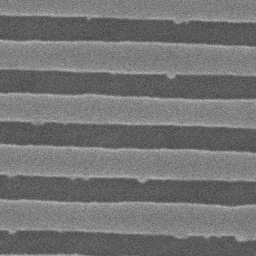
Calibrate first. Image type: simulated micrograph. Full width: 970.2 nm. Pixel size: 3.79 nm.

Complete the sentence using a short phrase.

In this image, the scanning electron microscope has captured lines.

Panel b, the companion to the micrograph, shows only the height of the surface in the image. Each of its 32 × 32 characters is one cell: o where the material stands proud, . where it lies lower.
oooooooooooooooooooooooooooooooo
oooooooooooooooooooooooooooooooo
......................o..ooooooo
................................
................................
oooooooooooooooooooooo..........
oooooooooooooooooooooooooooooooo
oooooooooooooooooooooooooooooooo
oooooooooooooooooooooooooooooooo
.....................o..........
................................
................................
ooooooooooooooooooooooo.........
oooooooooooooooooooooooooooooooo
oooooooooooooooooooooooooooooooo
...............ooooooooooooooooo
................................
................................
oooooooooo......................
oooooooooooooooooooooooooooooooo
oooooooooooooooooooooooooooooooo
oooooooooooooooooooooooooooooooo
.................o..........oooo
................................
................................
oooooooooooooooooooooooo........
oooooooooooooooooooooooooooooooo
oooooooooooooooooooooooooooooooo
oooooooooooooooooooooooooooooooo
......................o......ooo
................................
................................